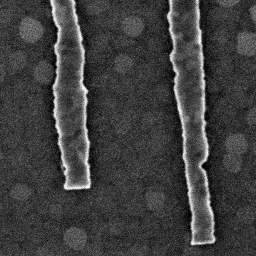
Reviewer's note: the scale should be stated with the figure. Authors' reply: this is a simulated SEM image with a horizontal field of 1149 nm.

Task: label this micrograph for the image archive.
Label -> one or a few lines or trenches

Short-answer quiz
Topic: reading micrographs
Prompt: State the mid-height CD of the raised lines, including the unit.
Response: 107 nm